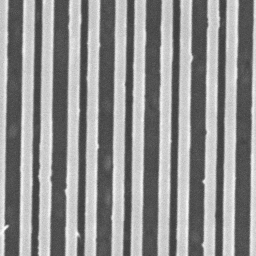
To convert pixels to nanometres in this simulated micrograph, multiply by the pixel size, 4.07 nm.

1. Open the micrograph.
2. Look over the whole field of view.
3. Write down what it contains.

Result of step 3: parallel lines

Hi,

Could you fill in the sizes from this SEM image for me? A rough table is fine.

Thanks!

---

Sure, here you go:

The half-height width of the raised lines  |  44.7 nanometers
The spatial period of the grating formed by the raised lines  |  91.8 nm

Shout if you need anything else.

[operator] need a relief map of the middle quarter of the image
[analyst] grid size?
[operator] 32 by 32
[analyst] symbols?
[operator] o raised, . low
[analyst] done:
.ooo..ooo....oo..ooo....ooo..ooo
.ooo..ooo....oo..ooo....ooo..ooo
.ooo..ooo....oo...oo....ooo..ooo
.ooo..ooo....oo...oo....ooo..ooo
.ooo..ooo....oo...oo....ooo..ooo
.ooo..ooo....oo..ooo....ooo..ooo
.ooo..oo.....oo..ooo....ooo..oo.
.ooo..oo.....oo..ooo....ooo..oo.
.ooo..oo.....oo..ooo....ooo..oo.
.ooo..oo.....oo..ooo....ooo..oo.
.ooo..oo.....oo..ooo....ooo..oo.
.ooo..oo.....oo..ooo....ooo..oo.
.ooo..oo.....oo..ooo....ooo..oo.
.ooo..oo.....oo..ooo....ooo..oo.
.ooo..oo.....oo..ooo....ooo..oo.
.ooo..oo.....oo..ooo....ooo..ooo
.ooo..oo.....oo..ooo....ooo..ooo
.ooo..oo.....oo..ooo....ooo..ooo
.ooo..oo.....oo..ooo....ooo..ooo
.ooo..oo.....oo..ooo....ooo..ooo
.ooo..ooo....oo..ooo....ooo..ooo
.oo..ooo....ooo..ooo....oo...oo.
.oo..ooo....ooo..ooo....oo...oo.
.oo..ooo....ooo..ooo....oo...oo.
.oo...oo....ooo..ooo....oo...oo.
.oo...oo....ooo..ooo....oo...oo.
.oo...oo....ooo..ooo....oo...oo.
.oo...oo....ooo..ooo....oo...oo.
.oo...oo....ooo..ooo....oo...oo.
.oo...oo....ooo..ooo....oo...oo.
.oo...oo....ooo..ooo....oo...oo.
.oo...oo....ooo..ooo....oo...oo.